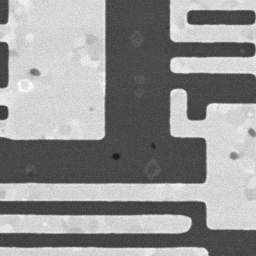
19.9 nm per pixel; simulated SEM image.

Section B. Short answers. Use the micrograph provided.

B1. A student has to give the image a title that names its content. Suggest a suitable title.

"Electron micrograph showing wiring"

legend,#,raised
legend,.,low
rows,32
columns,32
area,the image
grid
.############........###########
.############........###........
.############........##.........
#############........###########
#############........###########
.############...................
.############...................
.############.........##########
.############........###########
.############...................
.############...................
#############.........#.........
#############........##.........
.############........##...######
.############........##...######
#############........###########
#############........###########
..........................######
..........................######
..........................######
..........................######
..........................######
..........................######
################################
################################
..........................######
..........................######
########################..######
########################..######
................................
................................
##########################......